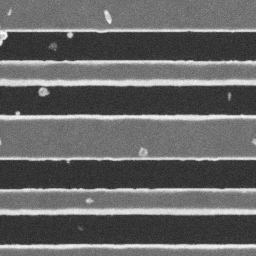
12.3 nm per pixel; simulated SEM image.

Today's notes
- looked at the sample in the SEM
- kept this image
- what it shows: lines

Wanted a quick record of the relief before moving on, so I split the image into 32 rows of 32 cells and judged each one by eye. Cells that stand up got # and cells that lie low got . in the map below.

################################
################################
################################
################################
#...............................
................................
................................
................................
################################
################################
................................
................................
................................
................................
.........##...................#.
################################
################################
################################
################################
################################
................................
................................
................................
................................
################################
################################
#########.######......#####..###
................................
................................
................................
................................
################################